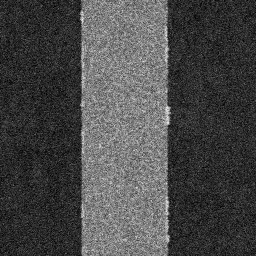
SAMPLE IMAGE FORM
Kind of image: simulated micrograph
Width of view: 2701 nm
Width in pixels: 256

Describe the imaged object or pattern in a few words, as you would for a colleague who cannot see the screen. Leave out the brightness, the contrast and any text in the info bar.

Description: one or a few lines or trenches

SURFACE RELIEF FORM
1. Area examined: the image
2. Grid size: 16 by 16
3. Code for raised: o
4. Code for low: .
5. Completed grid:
.....ooooo......
.....ooooo......
.....ooooo......
.....ooooo......
.....ooooo......
.....ooooo......
.....ooooo......
.....oooooo.....
.....ooooo......
.....ooooo......
.....ooooo......
.....ooooo......
.....oooooo.....
.....ooooo......
.....ooooo......
.....ooooo......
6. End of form